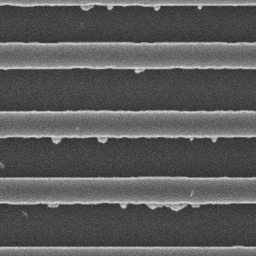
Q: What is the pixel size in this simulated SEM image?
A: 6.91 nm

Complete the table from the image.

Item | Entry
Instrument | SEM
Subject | lines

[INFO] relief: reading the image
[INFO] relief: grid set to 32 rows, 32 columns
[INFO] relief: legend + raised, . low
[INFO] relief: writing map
++++++++++++++++++++++++++++++++
................................
................................
................................
................................
++++++++++++++++++++++++++++++++
++++++++++++++++++++++++++++++++
++++++++++++++++++++++++++++++++
+++++++++..+++++++++++.+++.+..++
................................
................................
................................
................................
................................
++++++++++++++++++++++++++++++++
++++++++++++++++++++++++++++++++
++++++++++++++++++++++++++++++++
................................
................................
................................
................................
................................
++++++++++++++++++++++++++++++++
++++++++++++++++++++++++++++++++
++++++++++++++++++++++++++++++++
................................
................................
................................
................................
................................
................................
++++++++++++++++++++++++++++++++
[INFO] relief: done